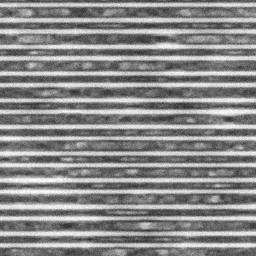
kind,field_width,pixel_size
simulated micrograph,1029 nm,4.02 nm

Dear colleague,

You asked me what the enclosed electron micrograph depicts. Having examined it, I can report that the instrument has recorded parallel lines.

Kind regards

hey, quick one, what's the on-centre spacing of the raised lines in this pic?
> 53.7 nanometers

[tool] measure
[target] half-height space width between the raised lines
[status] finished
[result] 33.7 nm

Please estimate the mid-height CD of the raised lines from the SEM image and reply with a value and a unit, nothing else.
3.63 px